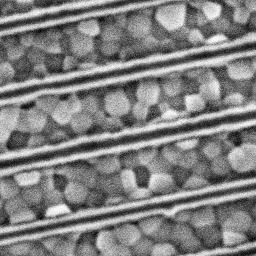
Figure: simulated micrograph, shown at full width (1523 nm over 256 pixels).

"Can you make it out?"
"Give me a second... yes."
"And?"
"one or a few lines or trenches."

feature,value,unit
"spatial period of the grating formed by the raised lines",409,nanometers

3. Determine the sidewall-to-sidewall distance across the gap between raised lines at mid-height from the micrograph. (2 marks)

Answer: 54.6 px